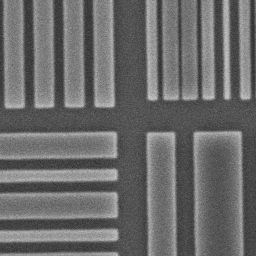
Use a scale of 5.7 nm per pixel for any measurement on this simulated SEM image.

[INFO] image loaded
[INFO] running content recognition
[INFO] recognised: groups of lines, slits or small figures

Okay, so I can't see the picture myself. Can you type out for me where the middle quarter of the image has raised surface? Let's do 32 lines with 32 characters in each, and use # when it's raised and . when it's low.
#####...####.........##..###..##
#####...####.........##..###..##
#####...####.........##..###..##
#####...####.........##..###..##
#####...####.........##..###..##
#####...####.........##..###..##
#####...####.........##..###..##
#####...####.........##..###..##
#####...####.........##..###..##
#####...####....................
.####...####....................
................................
................................
................................
................................
................................
................................
...##########..........####.....
#############........#######....
#############........#######....
#############........#######....
#############........#######....
#############........#######....
.....................#######....
.....................#######....
.....................#######....
.....................#######....
#############........#######....
#############........#######....
.....................#######....
.....................#######....
.....................#######....